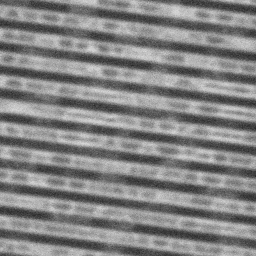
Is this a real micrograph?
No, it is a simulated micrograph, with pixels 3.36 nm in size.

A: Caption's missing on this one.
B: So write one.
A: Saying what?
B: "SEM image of parallel lines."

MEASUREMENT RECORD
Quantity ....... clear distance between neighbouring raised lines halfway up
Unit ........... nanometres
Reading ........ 39.5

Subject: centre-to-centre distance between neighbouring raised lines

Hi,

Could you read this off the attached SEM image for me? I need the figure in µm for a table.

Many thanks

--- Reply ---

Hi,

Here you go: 0.0777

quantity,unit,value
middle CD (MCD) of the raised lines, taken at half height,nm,36.1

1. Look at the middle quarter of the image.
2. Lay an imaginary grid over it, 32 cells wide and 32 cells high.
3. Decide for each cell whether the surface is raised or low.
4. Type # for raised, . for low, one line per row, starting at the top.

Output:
########........................
###############.................
....###################.........
...........###################..
...................#############
###.......................######
##########......................
################................
....########.###########........
............####################
...................#############
###........................#####
####.#####......................
##################..............
.....#.####.##############......
............####################
....................############
####.........................###
############....................
###################.............
.......####################.....
...............#################
......................##########
#####.........................##
############....................
.###################............
........###################.....
...............#################
.......................#########
#######.......................##
###############.................
...###################..........